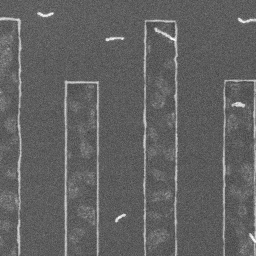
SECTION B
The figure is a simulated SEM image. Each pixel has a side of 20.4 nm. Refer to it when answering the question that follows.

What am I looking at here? one or a few lines or trenches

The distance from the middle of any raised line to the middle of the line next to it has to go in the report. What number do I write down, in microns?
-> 1.61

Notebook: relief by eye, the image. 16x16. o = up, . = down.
oooooooooooooooo
.oooooooo..ooooo
.oooooooo..ooooo
.oooooooo..ooooo
.oooooooo..ooooo
.ooo..ooo..ooo..
.ooo..ooo..ooo..
.ooo..ooo..ooo..
.ooo..ooo..ooo..
.ooo..ooo..ooo..
.ooo..ooo..ooo..
.ooo..ooo..ooo..
.ooo..ooo..ooo..
.ooo..ooo..ooo..
.ooo..ooo..ooo..
.ooo..ooo..ooo..